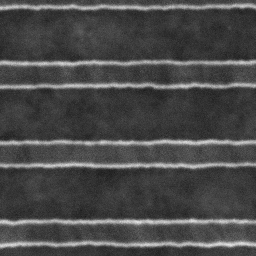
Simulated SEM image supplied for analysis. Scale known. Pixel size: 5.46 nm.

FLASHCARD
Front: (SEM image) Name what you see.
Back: lines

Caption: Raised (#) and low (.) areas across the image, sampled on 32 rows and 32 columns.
################################
................................
................................
................................
................................
................................
................................
................................
################################
################################
################################
................................
................................
................................
................................
................................
................................
................................
################################
################################
################################
................................
................................
................................
................................
................................
................................
................................
################################
################################
#####.####...#################.#
................................